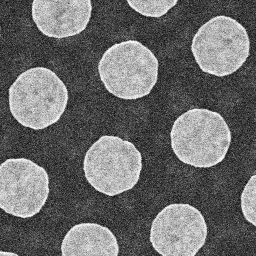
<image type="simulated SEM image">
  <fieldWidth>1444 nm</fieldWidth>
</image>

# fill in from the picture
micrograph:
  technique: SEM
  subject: raised bodies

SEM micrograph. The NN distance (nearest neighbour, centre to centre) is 530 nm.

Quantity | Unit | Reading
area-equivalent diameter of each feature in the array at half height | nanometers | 326